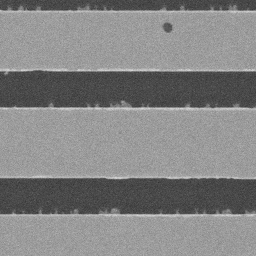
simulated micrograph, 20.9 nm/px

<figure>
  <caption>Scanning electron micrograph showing lines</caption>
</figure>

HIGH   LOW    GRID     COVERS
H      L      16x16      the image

LLLLLLLLLLLLLLLL
HHHHHHHHHHHHHHHH
HHHHHHHHHHHHHHHH
HHHHHHHHHHHHHHHH
LLLLLLLLLLLLLLLL
LLLLLLLLLLLLLLLL
LLLLLLLLLLLLLLLL
HHHHHHHHHHHHHHHH
HHHHHHHHHHHHHHHH
HHHHHHHHHHHHHHHH
HHHHHHHHHHHHHHHH
LLLLLLLLLLLLLLLL
LLLLLLLLLLLLLLLL
HHHHHHHHHHHHHHHH
HHHHHHHHHHHHHHHH
HHHHHHHHHHHHHHHH